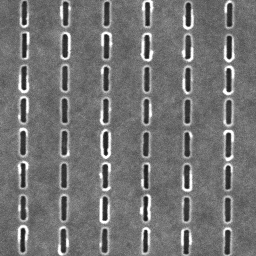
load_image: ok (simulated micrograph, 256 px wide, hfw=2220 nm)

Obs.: a regular array of holes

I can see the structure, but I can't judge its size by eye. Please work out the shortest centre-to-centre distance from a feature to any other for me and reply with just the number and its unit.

280 nm